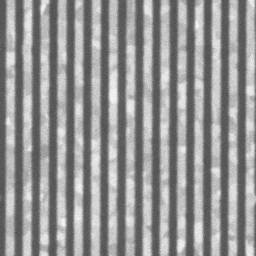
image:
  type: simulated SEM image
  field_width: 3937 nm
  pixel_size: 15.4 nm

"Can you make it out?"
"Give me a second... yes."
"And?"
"parallel lines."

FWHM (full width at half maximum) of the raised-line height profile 148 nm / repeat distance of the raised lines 263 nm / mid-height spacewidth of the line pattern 0.119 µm